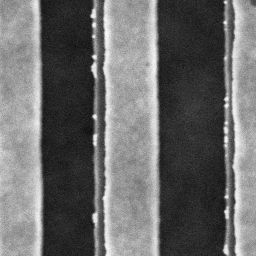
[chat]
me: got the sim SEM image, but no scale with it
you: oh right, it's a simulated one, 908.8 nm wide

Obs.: lines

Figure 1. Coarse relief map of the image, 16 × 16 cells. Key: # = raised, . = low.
##....####....##
##....####....##
##....####....##
##....####....##
##....####....##
##....####....##
##....####....##
##....####....##
##....####....##
##....####....##
##....####....##
###...####....##
###...####....##
###...####....##
###...####....##
###...####....##